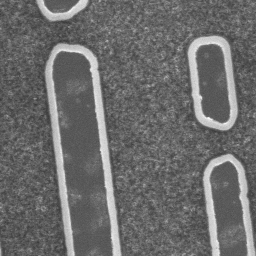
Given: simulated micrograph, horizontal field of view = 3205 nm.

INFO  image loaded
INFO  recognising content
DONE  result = one or a few lines or trenches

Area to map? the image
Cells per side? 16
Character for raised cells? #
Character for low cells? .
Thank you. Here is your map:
...##...........
................
................
...###......##..
...###......##..
...###......##..
...###......###.
...###.......#..
....##..........
....###.........
....###......##.
....###......##.
....###......##.
....###......##.
....###......###
....###......###